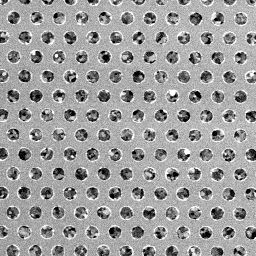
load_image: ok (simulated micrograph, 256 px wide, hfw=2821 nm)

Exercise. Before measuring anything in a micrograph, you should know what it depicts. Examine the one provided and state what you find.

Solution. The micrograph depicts a regular array of raised bodies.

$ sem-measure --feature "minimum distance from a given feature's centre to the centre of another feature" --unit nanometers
246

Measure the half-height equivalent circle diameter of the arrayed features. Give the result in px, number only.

13.3